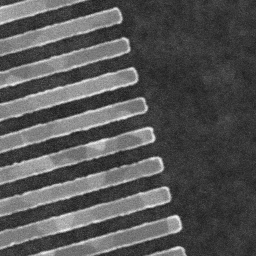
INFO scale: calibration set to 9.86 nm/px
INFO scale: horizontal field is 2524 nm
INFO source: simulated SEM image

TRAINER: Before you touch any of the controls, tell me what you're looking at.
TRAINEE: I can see parallel lines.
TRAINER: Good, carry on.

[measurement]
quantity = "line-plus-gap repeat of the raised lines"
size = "302 nanometers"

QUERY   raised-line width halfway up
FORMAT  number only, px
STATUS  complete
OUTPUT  15.5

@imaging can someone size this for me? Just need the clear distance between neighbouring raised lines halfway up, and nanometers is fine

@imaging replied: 153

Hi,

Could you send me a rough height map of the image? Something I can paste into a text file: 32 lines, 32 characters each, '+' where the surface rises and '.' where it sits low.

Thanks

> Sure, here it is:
..+++++++.......................
+++++........++.................
++.......++++++.................
......++++++....................
..+++++++.......................
++++++.......+++................
++.......+++++++................
......++++++....................
..+++++++.......................
++++++.......++++...............
++.......+++++++................
......++++++....................
..+++++++.......++..............
++++++.......+++++..............
++.......+++++++................
......+++++++...................
..+++++++.......+++.............
++++++.......++++++.............
++.......+++++++................
......+++++++...................
..+++++++........+++............
++++++.......+++++++............
++.......+++++++................
......+++++++.......+...........
..+++++++........++++...........
+++++........+++++++............
++.......++++++++...............
......+++++++.......++..........
..+++++++........+++++..........
+++++........+++++++............
++........+++++++...............
......+++++++.......+++.........